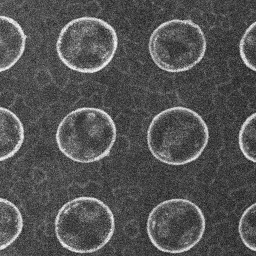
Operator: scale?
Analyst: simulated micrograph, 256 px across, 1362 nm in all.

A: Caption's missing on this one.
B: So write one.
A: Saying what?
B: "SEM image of raised bodies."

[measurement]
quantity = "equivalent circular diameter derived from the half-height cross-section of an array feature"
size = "0.298 µm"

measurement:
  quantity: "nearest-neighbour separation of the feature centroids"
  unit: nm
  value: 480